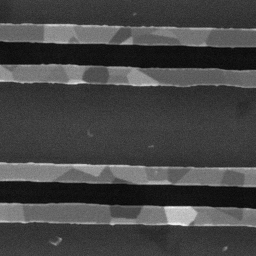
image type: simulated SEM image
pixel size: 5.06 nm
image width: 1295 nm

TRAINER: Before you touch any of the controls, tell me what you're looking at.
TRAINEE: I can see lines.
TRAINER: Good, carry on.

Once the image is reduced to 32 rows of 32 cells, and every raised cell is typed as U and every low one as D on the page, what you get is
DDDDDDDDDDDDDDDDDDDDDDDDDDDDDDDD
DDDDDDDDDDDDDDDDDDDDDDDDDDDDDDDD
DDDDDDDDDDDDDDDDDDDDDDDDDDDDDDDD
UUUUUUUUUUUUUUUUUUUUUUDDDDDDDDDD
UUUUUUUUUUUUUUUUUUUUUUUUUUUUUUUU
DDDDDDDDDDDDDUUUUUUUUUUUUUUUUUUU
DDDDDDDDDDDDDDDDDDDDDDDDDDDDDDDD
DDDDDDDDDDDDDDDDDDDDDDDDDDDDDDDD
UUUUUUUUUUUUUUUUUUUUDDDDDDDDDDDD
UUUUUUUUUUUUUUUUUUUUUUUUUUUUUUUU
DDDDDDDDDDDDDDUUUUUUUUUUUUUUUUUU
DDDDDDDDDDDDDDDDDDDDDDDDDDDDDDDD
DDDDDDDDDDDDDDDDDDDDDDDDDDDDDDDD
DDDDDDDDDDDDDDDDDDDDDDDDDDDDDDDD
DDDDDDDDDDDDDDDDDDDDDDDDDDDDDDDD
DDDDDDDDDDDDDDDDDDDDDDDDDDDDDDDD
DDDDDDDDDDDDDDDDDDDDDDDDDDDDDDDD
DDDDDDDDDDDDDDDDDDDDDDDDDDDDDDDD
DDDDDDDDDDDDDDDDDDDDDDDDDDDDDDDD
DDDDDDDDDDDDDDDDDDDDDDDDDDDDDDDD
UUUUUUUDDDDDDDDDDDDDDDDDDDDDDDDD
UUUUUUUUUUUUUUUUUUUUUUUUUUUUUUUU
UUUUUUUUUUUUUUUUUUUUUUUUUUUUUUUU
DDDDDDDDDDDDDDDDDDDDDDDDDDDDDDDD
DDDDDDDDDDDDDDDDDDDDDDDDDDDDDDDD
UUUDDDUUUUUDDDDDDDDDDDDDDDDDDDDD
UUUUUUUUUUUUUUUUUUUUUUUUUUUUUUUU
UUUUUUUUUUUUUUUUUUUUUUUUUUUUUUUU
DDDDDDDDDDDDDDDDDDDDDDDDDDDDDDDD
DDDDDDDDDDDDDDDDDDDDDDDDDDDDDDDD
DDDDDDDDDDDDDDDDDDDDDDDDDDDDDDDD
DDDDDDDDDDDDDDDDDDDDDDDDDDDDDDDD